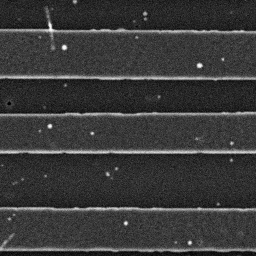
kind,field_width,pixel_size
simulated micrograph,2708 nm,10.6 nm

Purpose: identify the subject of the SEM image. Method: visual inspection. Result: lines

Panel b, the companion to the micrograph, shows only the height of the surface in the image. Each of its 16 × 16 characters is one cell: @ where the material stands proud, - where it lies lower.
----------------
----------------
@@@@@@@@@@@@@@@@
@@@@@@@@@@@@@@@@
@@@@@@@@@@@@@@@@
----------------
----------------
@@@@@@@@@@@@@@@@
@@@@@@@@@@@@@@@@
@-@@@@@@@@@@-@@@
----------------
----------------
----------------
@@@@@@@@@@@@@@@@
@@@@@@@@@@@@@@@@
@@@@@@@@@@@@@@@@